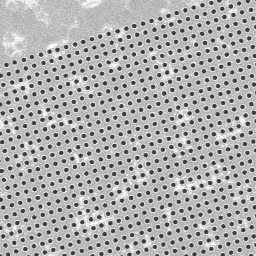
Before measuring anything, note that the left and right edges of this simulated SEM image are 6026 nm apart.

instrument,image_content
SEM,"a regular array of holes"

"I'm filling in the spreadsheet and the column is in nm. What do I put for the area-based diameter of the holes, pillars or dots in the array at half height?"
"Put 113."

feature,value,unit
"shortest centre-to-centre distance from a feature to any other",202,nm